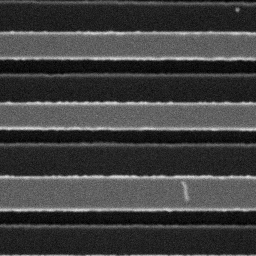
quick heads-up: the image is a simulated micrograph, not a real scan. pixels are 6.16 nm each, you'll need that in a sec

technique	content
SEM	lines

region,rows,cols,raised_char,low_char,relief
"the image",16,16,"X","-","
----------------
----------------
XXXXXXXXXXXXXXXX
XXXXXXXXXXXXXXXX
----------------
----------------
XXXXXXXXXXXXXXXX
XXXXXXXXXXXXXXXX
----------------
----------------
----------------
XXXXXXXXXXXXXXXX
XXXXXXXXXXXXXXXX
----------------
----------------
----------------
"